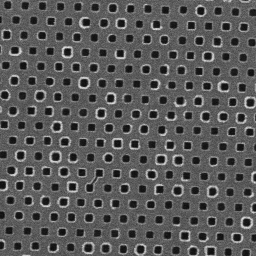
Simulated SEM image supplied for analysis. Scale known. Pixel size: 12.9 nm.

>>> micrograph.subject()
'a regular array of holes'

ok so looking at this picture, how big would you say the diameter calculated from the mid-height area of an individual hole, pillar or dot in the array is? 0.107 µm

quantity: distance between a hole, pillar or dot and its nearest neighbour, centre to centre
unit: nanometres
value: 220